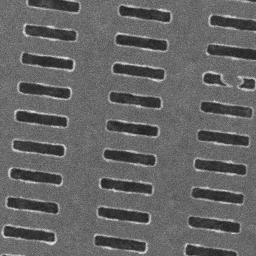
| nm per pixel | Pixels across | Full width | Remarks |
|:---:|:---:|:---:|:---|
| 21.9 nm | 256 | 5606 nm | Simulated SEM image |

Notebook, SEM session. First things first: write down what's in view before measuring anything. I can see a regular array of holes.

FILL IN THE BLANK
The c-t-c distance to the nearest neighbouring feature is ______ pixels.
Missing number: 28.8